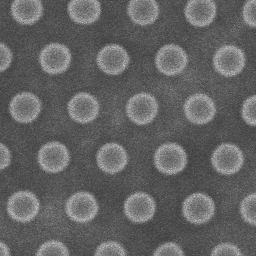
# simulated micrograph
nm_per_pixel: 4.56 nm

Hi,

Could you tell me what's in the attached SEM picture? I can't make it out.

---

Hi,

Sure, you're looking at a regular array of raised bodies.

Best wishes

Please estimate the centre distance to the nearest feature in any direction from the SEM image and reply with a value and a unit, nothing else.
0.259 µm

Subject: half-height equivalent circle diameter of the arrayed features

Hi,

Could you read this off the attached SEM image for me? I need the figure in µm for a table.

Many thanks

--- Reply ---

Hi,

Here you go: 0.133